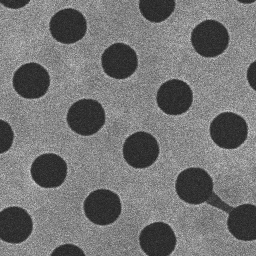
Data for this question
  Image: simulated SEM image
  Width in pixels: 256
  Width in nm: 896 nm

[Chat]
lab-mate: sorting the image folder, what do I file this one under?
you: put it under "a regular array of holes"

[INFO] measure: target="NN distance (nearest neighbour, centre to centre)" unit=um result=0.223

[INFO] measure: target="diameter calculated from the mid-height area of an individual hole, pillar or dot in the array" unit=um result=0.129